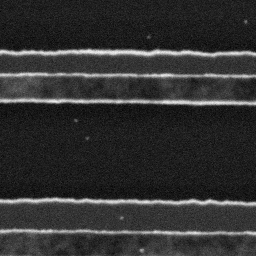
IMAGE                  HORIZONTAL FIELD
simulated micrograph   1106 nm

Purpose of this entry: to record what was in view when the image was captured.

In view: lines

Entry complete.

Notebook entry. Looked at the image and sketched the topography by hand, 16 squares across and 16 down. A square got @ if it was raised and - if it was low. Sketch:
----------------
----------------
----------------
@@@@@@@@@@@@@@@@
@@@@@@@@@@@@@@@@
@@@@@@@@@@@@@@@@
----------------
----------------
----------------
----------------
----------------
----------------
----------------
@@@@@@@@@@@@@@@@
@@@@@@@@@@@@@@@@
@@@@@@@@@@@@@@@@